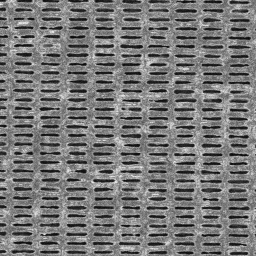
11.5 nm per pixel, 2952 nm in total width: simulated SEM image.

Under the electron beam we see a regular array of holes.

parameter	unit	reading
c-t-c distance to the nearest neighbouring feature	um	0.102